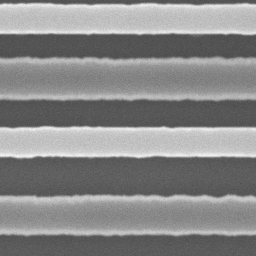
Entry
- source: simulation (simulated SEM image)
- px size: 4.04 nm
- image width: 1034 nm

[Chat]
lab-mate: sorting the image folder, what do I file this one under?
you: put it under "lines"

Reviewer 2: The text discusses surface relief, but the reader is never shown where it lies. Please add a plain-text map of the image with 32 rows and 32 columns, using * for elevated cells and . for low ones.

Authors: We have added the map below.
*******..........***.*.......***
********************************
********************************
********************************
................................
................................
................................
**************.*****************
********************************
********************************
********************************
********************************
................................
................................
................................
................................
********************************
********************************
********************************
*******************.************
................................
................................
................................
................................
................................
********************************
********************************
********************************
********************************
................................
................................
................................